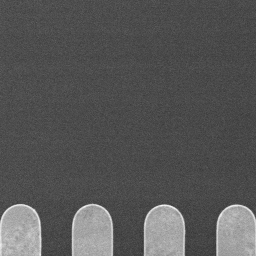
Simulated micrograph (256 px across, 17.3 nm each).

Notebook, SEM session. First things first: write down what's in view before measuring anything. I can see groups of lines, slits or small figures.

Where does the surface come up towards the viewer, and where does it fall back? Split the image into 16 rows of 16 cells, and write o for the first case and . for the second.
................
................
................
................
................
................
................
................
................
................
................
................
................
oo...oo..oo...oo
ooo..oo..ooo..oo
ooo..oo..ooo..oo